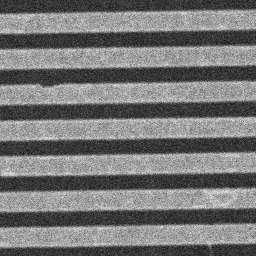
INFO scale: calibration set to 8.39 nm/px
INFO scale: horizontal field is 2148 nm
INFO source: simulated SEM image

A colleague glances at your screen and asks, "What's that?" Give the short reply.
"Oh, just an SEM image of parallel lines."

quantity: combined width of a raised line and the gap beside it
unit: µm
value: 0.299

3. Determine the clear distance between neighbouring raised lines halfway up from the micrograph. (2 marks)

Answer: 15.4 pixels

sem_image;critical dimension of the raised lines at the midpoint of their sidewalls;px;20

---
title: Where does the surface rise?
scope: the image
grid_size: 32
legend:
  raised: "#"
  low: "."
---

................................
..............##################
################################
################################
................................
................................
################################
################################
#########.......................
................................
...........#####################
################################
################################
................................
................................
################################
################################
#######.........................
................................
..######.#######################
################################
################################
................................
................................
################################
################################
................................
................................
################################
################################
#########################.#..##.
................................